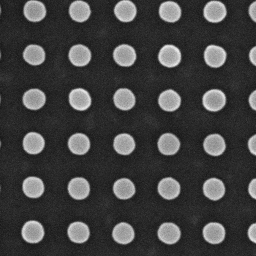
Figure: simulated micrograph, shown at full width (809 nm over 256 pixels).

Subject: a regular array of raised bodies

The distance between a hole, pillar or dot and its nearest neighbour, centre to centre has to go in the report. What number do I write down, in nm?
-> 140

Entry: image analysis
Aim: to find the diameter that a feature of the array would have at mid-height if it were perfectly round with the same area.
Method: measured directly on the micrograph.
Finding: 67.9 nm